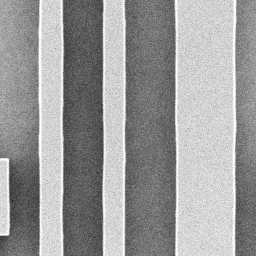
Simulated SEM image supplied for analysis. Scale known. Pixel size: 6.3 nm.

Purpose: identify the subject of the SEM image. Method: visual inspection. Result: groups of lines, slits or small figures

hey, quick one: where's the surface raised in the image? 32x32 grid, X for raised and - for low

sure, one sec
-----XXX-----XX-------XXXXXXX---
-----XXX-----XX-------XXXXXXX---
-----XXX-----XXX------XXXXXXX---
-----XXX-----XXX------XXXXXXX---
-----XXX-----XXX------XXXXXXX---
-----XXX-----XXX------XXXXXXX---
-----XXX-----XXX------XXXXXXX---
-----XXX-----XXX------XXXXXXX---
-----XXX-----XXX------XXXXXXX---
-----XXX-----XXX------XXXXXXX---
-----XXX-----XXX------XXXXXXX---
-----XXX-----XXX------XXXXXXX---
-----XXX-----XXX------XXXXXXX---
-----XXX-----XXX------XXXXXXX---
-----XXX-----XXX------XXXXXXX---
-----XXX-----XX-------XXXXXXX---
-----XXX-----XX-------XXXXXXX---
-----XXX-----XX-------XXXXXXX---
-----XXX-----XX-------XXXXXXX---
-----XXX-----XXX------XXXXXXX---
X----XXX-----XXX------XXXXXXX---
X----XXX-----XX-------XXXXXXX---
X----XXX-----XX-------XXXXXXX---
X----XXX-----XX-------XXXXXXX---
X----XXX-----XX-------XXXXXXX---
X----XXX-----XX-------XXXXXXX---
X----XXX-----XX-------XXXXXXX---
X----XXX-----XX-------XXXXXXX---
X----XXX-----XX-------XXXXXXX---
-----XXX-----XX-------XXXXXXX---
-----XXX-----XX-------XXXXXXX---
-----XXX-----XX-------XXXXXXX---